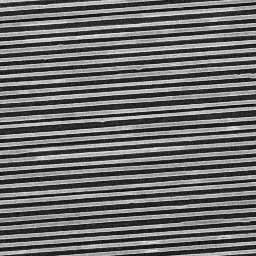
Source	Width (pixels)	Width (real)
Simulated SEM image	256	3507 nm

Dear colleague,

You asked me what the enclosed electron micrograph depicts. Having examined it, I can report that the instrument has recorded parallel lines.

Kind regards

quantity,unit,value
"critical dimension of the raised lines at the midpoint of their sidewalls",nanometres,54.6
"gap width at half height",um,0.0649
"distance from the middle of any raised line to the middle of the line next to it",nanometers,115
